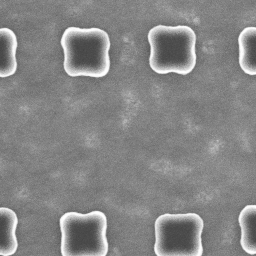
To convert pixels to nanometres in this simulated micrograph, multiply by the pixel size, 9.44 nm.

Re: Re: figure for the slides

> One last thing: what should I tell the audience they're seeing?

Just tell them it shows raised bodies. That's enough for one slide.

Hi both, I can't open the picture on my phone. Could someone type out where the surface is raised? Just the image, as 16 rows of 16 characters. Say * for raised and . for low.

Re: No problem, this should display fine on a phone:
................
................
*...***..***...*
*...***..***...*
*...**.....*....
................
................
................
................
................
................
................
................
*...**....**...*
*...***...***..*
*...***...***..*